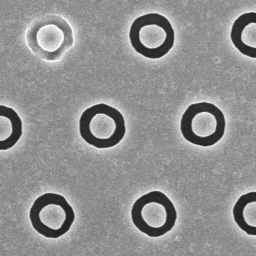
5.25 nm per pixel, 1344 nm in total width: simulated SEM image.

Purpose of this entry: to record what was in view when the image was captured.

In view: ring-shaped grooves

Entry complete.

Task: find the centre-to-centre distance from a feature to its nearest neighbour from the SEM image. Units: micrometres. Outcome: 0.535